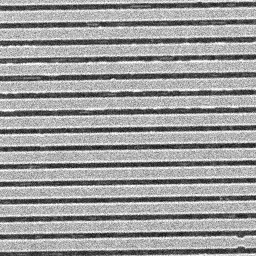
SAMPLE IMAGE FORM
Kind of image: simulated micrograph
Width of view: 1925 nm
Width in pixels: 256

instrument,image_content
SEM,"parallel lines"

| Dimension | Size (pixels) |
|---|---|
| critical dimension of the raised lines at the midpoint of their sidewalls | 11.4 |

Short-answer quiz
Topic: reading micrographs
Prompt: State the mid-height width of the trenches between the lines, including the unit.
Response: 47 nanometers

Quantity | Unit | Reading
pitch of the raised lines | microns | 0.132